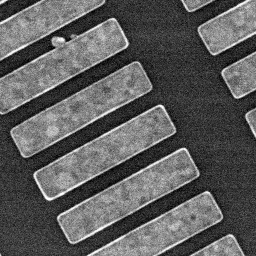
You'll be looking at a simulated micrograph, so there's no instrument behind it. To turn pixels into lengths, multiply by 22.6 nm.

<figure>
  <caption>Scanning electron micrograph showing groups of lines, slits or small figures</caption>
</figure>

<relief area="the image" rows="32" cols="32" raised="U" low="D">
DDDDDUUUUUUUUDDDDDDDDDDUUUDDDDUU
DDDUUUUUUUUDDDDDDDDDDDDDDDDDUUUU
DUUUUUUUUDDDDDDDDDDDDDDDDDUUUUUU
UUUUUUUDDDDDUUUDDDDDDDDDDUUUUUUU
UUUUUUDDDDUUUUUUDDDDDDDDDUUUUUUD
UUUUDDDUUUUUUUUUDDDDDDDDDDUUUDDD
UUDDDDUUUUUUUUUDDDDDDDDDDDUUDDDD
DDDDUUUUUUUUUDDDDDDDDDDDDDDDDDUU
DDDUUUUUUUUDDDDUUUDDDDDDDDDDUUUU
DUUUUUUUUDDDDDUUUUDDDDDDDDDDUUUU
UUUUUUUDDDDDUUUUUUUDDDDDDDDDUUUU
UUUUUDDDDDUUUUUUUUDDDDDDDDDDDUUD
UUUUDDDDUUUUUUUUDDDDDDDDDDDDDDDD
UUDDDDUUUUUUUUUDDDDUDDDDDDDDDDDD
DDDDUUUUUUUUUDDDDUUUUDDDDDDDDDDU
DDDUUUUUUUUDDDDDUUUUUUDDDDDDDDDU
DUUUUUUUUDDDDDUUUUUUUUDDDDDDDDDD
DDUUUUUDDDDDUUUUUUUUDDDDDDDDDDDD
DDUUUUDDDDUUUUUUUUDDDDDDDDDDDDDD
DDDUDDDDUUUUUUUUUDDDDUUUDDDDDDDD
DDDDDDUUUUUUUUUDDDDUUUUUDDDDDDDD
DDDDDUUUUUUUUDDDDUUUUUUUUDDDDDDD
DDDDDUUUUUUDDDDDUUUUUUUUDDDDDDDD
DDDDDUUUUDDDDDUUUUUUUUDDDDDDDDDD
DDDDDDUDDDDDUUUUUUUUDDDDDUDDDDDD
DDDDDDDDDDUUUUUUUUDDDDDUUUUDDDDD
DDDDDDDDUUUUUUUUUDDDDUUUUUUUDDDD
DDDDDDDUUUUUUUUDDDDUUUUUUUUDDDDD
DDDDDDDDUUUUUDDDDUUUUUUUUUDDDDDD
DDDDDDDDUUUDDDDUUUUUUUUUDDDDUDDD
DDDDDDDDDDDDDDUUUUUUUUDDDDDUUUDD
DDDDDDDDDDDDUUUUUUUUDDDDDUUUUUDD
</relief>